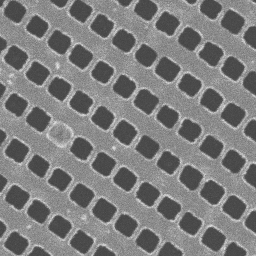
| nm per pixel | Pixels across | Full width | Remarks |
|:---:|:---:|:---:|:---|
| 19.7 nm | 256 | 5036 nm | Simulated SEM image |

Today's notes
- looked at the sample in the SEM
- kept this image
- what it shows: a regular array of holes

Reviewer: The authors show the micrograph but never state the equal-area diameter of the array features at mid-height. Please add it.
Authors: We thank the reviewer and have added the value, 0.442 um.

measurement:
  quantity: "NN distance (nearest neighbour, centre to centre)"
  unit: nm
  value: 517